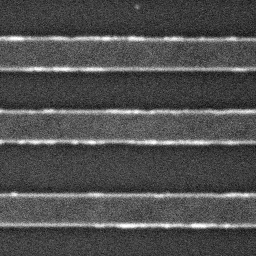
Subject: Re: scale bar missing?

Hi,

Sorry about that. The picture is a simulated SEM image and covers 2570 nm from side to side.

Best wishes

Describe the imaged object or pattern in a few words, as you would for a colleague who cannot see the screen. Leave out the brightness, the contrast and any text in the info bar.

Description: lines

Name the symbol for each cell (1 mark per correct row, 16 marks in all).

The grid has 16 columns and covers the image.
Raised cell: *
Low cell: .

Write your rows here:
................
................
****************
****************
................
................
................
****************
****************
................
................
................
****************
****************
................
................